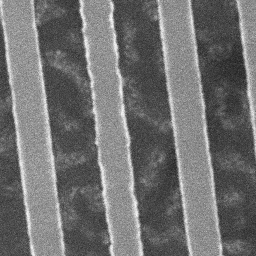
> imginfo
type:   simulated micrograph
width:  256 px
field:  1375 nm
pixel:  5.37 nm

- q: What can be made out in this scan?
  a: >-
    one or a few lines or trenches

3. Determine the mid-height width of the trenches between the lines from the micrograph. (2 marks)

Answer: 257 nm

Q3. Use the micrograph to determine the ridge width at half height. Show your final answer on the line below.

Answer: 168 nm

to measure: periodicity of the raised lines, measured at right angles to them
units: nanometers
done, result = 420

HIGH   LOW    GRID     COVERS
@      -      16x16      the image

@@---@@---@@---@
@@---@@---@@---@
@@---@@---@@---@
@@---@@---@@---@
-@@---@---@@---@
-@@---@@---@@---
-@@---@@---@@---
-@@---@@---@@---
-@@---@@---@@---
-@@---@@---@@---
-@@---@@---@@---
-@@---@@---@@---
--@@---@---@@---
--@@---@@---@@--
--@@---@@---@@--
--@@---@@---@@--